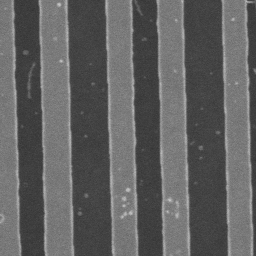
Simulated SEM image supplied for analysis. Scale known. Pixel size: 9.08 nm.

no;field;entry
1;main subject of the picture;lines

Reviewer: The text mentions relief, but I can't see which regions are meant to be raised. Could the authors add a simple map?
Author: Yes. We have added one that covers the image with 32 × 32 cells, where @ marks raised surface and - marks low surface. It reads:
@@---@@@-----@@@----@@@-----@@@-
@@---@@@-----@@@----@@@-----@@@-
@@---@@@-----@@@----@@@-----@@@-
@@---@@@-----@@@@---@@@-----@@@-
@@---@@@-----@@@----@@@-----@@@-
@@---@@@-----@@@@---@@@-----@@@-
@@---@@@-----@@@@---@@@-----@@@-
@@---@@@@----@@@@---@@@-----@@@-
@@---@@@@----@@@@---@@@-----@@@-
@@---@@@@----@@@@---@@@-----@@@-
@@---@@@@----@@@@---@@@-----@@@-
@@---@@@@-----@@@---@@@-----@@@-
@@---@@@@-----@@@---@@@-----@@@-
@@---@@@@-----@@@---@@@-----@@@-
@@---@@@@-----@@@---@@@-----@@@-
@@---@@@@-----@@@---@@@-----@@@-
@@---@@@@-----@@@---@@@-----@@@-
@@---@@@@-----@@@---@@@-----@@@-
@@---@@@@-----@@@---@@@-----@@@-
@@---@@@@-----@@@---@@@-----@@@-
@@---@@@@-----@@@---@@@-----@@@-
@@---@@@@-----@@@---@@@-----@@@-
@@---@@@@-----@@@---@@@-----@@@-
@@---@@@@-----@@@---@@@-----@@@-
@@---@@@@-----@@@---@@@@----@@@-
@@----@@@-----@@@---@@@@----@@@-
@@----@@@-----@@@---@@@@----@@@-
@@----@@@-----@@@---@@@@----@@@-
@@----@@@-----@@@---@@@@-----@@@
@@----@@@-----@@@---@@@@-----@@@
@@@---@@@-----@@@---@@@@-----@@@
@@@---@@@-----@@@---@@@@-----@@@